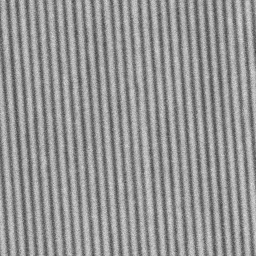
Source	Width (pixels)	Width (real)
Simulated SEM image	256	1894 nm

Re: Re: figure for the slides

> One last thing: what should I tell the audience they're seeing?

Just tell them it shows parallel lines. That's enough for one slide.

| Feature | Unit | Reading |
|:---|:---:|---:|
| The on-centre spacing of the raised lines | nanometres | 69.2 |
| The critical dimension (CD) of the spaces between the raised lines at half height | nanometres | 27.7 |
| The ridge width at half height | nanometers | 41.5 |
